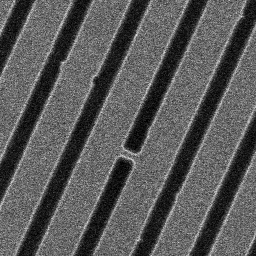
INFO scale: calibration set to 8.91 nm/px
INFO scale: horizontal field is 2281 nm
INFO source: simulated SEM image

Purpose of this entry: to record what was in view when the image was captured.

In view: parallel lines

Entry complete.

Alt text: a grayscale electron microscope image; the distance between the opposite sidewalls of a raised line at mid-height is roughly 332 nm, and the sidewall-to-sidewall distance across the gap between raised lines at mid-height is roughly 139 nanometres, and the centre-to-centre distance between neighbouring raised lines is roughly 470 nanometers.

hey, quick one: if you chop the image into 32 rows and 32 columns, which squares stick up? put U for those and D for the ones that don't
UUDDUUUUUDDUUUUUDDDUUUUUDDUUUUUD
UDDDUUUUUDDUUUUUDDUUUUUDDUUUUUDD
UDDUUUUUDDUUUUUDDDUUUUUDDUUUUUDD
UDDUUUUUDDUUUUUDDUUUUUDDUUUUUDDD
DDUUUUUDDUUUUUUDDUUUUUDDUUUUUDDU
DDUUUUUDDUUUUUDDUUUUUDDUUUUUUDDU
DUUUUUDDDUUUUUDDUUUUUDDUUUUUDDUU
DUUUUUDDUUUUUDDUUUUUDDDUUUUUDDUU
UUUUUDDUUUUUUDDUUUUUDDUUUUUDDUUU
UUUUUDDUUUUUDDUUUUUUDDUUUUUDDUUU
UUUUUDDUUUUUDDUUUUUDDUUUUUDDUUUU
UUUUDDUUUUUDDDUUUUUDDUUUUUDDUUUU
UUUUDDUUUUUDDUUUUUDDUUUUUDDDUUUU
UUUDDUUUUUDDDUUUUUDDUUUUUDDUUUUU
UUUDDUUUUUDDUUUUUDDUUUUUDDDUUUUU
UUDDUUUUUUDDUUUUUDDUUUUUDDUUUUUD
UUDDUUUUUDDUUUUUDDUUUUUUDDUUUUUD
UDDDUUUUUDDUUUUUDDUUUUUDDUUUUUDD
UDDUUUUUDDUUUUUUDDUUUUUDDUUUUUDD
DDDUUUUUDDUUUUUUUUUUUUDDUUUUUDDU
DDUUUUUDDUUUUUUDUUUUUUDDUUUUUDDU
DDUUUUUDDUUUUUDDUUUUUDDUUUUUDDDU
DUUUUUDDDUUUUUDDUUUUUDDUUUUUDDUU
DUUUUUDDUUUUUDDUUUUUDDDUUUUUDDUU
UUUUUDDDUUUUUDDUUUUUDDUUUUUDDUUU
UUUUUDDUUUUUDDUUUUUDDDUUUUUDDUUU
UUUUUDDUUUUUDDUUUUUDDUUUUUDDUUUU
UUUUDDUUUUUDDDUUUUDDDUUUUUDDUUUU
UUUUDDUUUUUDDUUUUUDDUUUUUDDUUUUU
UUUDDUUUUUDDDUUUUUDDUUUUUDDUUUUU
UUUDDUUUUUDDUUUUUDDUUUUUDDDUUUUU
UUDDUUUUUUDDUUUUUDDUUUUUDDUUUUUD